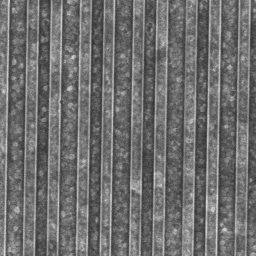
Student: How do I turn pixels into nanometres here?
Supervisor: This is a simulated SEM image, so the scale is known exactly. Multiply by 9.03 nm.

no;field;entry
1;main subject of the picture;parallel lines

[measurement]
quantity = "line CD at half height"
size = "0.0993 um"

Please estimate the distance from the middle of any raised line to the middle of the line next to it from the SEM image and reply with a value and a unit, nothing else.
239 nm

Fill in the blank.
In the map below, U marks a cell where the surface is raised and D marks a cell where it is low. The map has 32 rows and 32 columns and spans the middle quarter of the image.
DDDDUUDDDDUUDDDDDUUUDDDUUUDDDDUU
DDDDUUDDDDUUDDDDDUUUDDDUUUDDDDUU
DDDDUUDDDDUUDDDDDUUUDDDUUUDDDDUU
DDDDUUDDDDUUDDDDDUUUDDDUUUDDDDUU
DDDDUUDDDDUUDDDDDUUUDDDUUDDDDDUU
DDDDUUDDDDUUDDDDDUUUDDDUUDDDDDUU
DDDDUUDDDDUUDDDDDUUUDDDUUDDDDDUU
DDDDUUDDDDUUDDDDDUUUDDDUUDDDDDUU
DDDDUUDDDDUUDDDDDUUUDDDUUDDDDDUU
DDDDUUDDDDUUDDDDDUUUDDDUUDDDDDUU
DDDDUUDDDDUUDDDDDUUUDDDUUDDDDDUU
DDDDUUDDDDUUDDDDDUUUDDDUUDDDDDUU
DDDDUUDDDDUUDDDDDUUUDDDUUDDDDDUU
DDDDUUDDDDUUDDDDDUUUDDDUUDDDDDUU
DDDDUUDDDDUUDDDDDUUUDDDUUDDDDDUU
DDDDUUDDDDUUDDDDDUUUDDDUUDDDDDUU
DDDDUUDDDDUUDDDDDUUUDDDUUDDDDDUU
DDDDUUDDDDUUDDDDDUUDDDDUUDDDDDUU
DDDDUUDDDDUUDDDDDUUDDDDUUDDDDDUU
DDDDUUDDDDUUDDDDDUUDDDDUUDDDDDUU
DDDDUUDDDDUUDDDDDUUDDDDUUDDDDDUU
DDDDUUDDDUUUDDDDDUUDDDDUUDDDDDUU
DDDDUUDDDUUUDDDDDUUDDDDUUDDDDDUU
DDDDUUDDDUUUDDDDDUUDDDDUUDDDDDUU
DDDDUUDDDUUUDDDDDUUDDDDUUDDDDDUU
DDDDUUDDDUUUDDDDDUUDDDDUUDDDDDUU
DDDDUUDDDUUUDDDDDUUDDDDUUDDDDDUU
DDDDUUDDDUUUDDDDDUUDDDDUUDDDDDUU
DDDDUUDDDUUUDDDDDUUDDDDUUDDDDDUU
DDDDUUDDDUUUDDDDDUUDDDDUUDDDDDUU
DDDDUUDDDUUUDDDDDUUDDDDUUDDDDDUU
DDDDUUDDDUUUDDDDDUUDDDUUUDDDDDUU